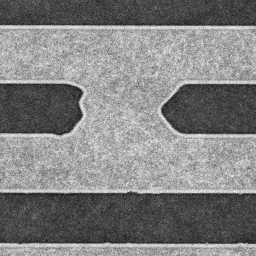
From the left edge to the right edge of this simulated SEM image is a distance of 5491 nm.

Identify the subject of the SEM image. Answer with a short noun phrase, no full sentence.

one or a few lines or trenches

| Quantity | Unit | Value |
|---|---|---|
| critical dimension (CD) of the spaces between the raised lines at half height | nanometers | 1160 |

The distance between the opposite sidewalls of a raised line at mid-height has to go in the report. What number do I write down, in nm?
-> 1180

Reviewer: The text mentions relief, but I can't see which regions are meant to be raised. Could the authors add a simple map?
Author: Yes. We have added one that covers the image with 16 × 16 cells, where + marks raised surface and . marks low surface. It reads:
................
................
++++++++++++++++
++++++++++++++++
++++++++++++++++
.....++++++.....
.....+++++......
.....+++++......
....++++++++....
++++++++++++++++
++++++++++++++++
++++++++++++++++
................
................
................
++++++++++++++++